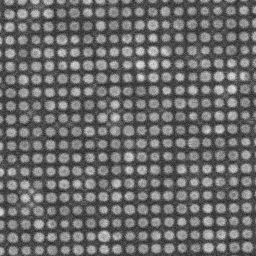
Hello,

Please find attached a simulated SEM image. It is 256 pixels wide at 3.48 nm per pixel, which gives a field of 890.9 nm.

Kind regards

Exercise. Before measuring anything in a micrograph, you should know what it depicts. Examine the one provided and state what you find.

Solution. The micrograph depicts a regular array of raised bodies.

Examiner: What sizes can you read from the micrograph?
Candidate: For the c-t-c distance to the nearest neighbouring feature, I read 44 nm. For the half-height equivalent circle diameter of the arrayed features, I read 0.0299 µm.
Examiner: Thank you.